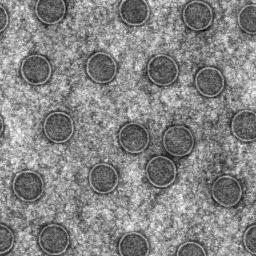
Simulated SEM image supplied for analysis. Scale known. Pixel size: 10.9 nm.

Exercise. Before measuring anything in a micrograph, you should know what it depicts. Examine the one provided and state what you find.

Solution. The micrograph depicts a regular array of raised bodies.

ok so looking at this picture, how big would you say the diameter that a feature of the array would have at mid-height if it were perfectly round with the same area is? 0.318 micrometres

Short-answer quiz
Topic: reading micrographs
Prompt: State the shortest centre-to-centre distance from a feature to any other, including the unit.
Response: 647 nanometers